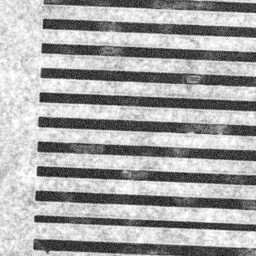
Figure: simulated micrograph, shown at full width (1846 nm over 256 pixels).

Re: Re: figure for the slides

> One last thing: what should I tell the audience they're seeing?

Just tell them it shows parallel lines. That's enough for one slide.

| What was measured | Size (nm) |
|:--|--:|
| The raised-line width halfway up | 92.7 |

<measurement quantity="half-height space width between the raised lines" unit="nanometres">81.9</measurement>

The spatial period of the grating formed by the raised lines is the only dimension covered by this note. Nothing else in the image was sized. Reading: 176 nanometers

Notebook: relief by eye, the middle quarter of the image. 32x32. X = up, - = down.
XXXXXXXXXXXXXXXXXXXXXXXXXXXXXXXX
--------------XXXXXXXXXXXXXXXXXX
--------------------------------
--------------------------------
XXXXXXXXXXXXX-------------------
XXXXXXXXXXXXXXXXXXXXXXXXXXXXXXXX
XXXXXXXXXXXXXXXXXXXXXXXXXXXXXXXX
-------------XXXXXXXXXXXXXXXXXXX
--------------------------------
--------------------------------
XXXXXXX-------------------------
XXXXXXXXXXXXXXXXXXXXXXXXXXXXXXX-
XXXXXXXXXXXXXXXXXXXXXXXXXXXXXXXX
-------XXXXXXXXXXXXXXXXXXXXXXXXX
-------------------------------X
--------------------------------
X-------------------------------
XXXXXXXXXXXXXXXXXXXXXXXXXXX-----
XXXXXXXXXXXXXXXXXXXXXXXXXXXXXXXX
--XXXXXXXXXXXXXXXXXXXXXXXXXXXXXX
-------------------------XXXXXXX
--------------------------------
--------------------------------
XXXXXXXXXXXXXXXXXXXXXXXX--------
XXXXXXXXXXXXXXXXXXXXXXXXXXXXXXXX
XXXXXXXXXXXXXXXXXXXXXXXXXXXXXXXX
------------------------XXXXXXXX
--------------------------------
--------------------------------
XXXXXXXXXXXXXXXXXX--------------
XXXXXXXXXXXXXXXXXXXXXXXXXXXXXXXX
XXXXXXXXXXXXXXXXXXXXXXXXXXXXXXXX